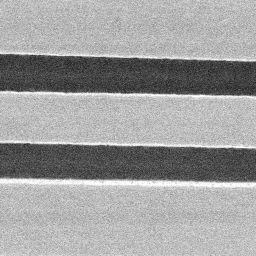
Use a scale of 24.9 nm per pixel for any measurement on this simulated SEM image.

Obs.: lines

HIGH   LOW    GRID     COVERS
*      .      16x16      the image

****************
****************
****************
.......*********
................
................
****************
****************
****************
................
................
********........
****************
****************
****************
****************